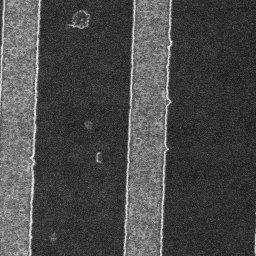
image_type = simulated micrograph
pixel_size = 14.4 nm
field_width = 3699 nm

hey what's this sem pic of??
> one or a few lines or trenches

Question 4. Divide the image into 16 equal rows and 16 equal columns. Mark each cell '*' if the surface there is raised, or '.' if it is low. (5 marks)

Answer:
..******...*****
..******...*****
..******...*****
..******...*****
..******..******
..******..******
..******..******
..******..******
..******..******
..******..******
..******..******
..******..******
..******..******
..******..******
..******..******
..******..******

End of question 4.